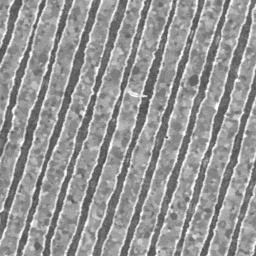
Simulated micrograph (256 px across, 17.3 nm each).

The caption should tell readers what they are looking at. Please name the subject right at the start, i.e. parallel lines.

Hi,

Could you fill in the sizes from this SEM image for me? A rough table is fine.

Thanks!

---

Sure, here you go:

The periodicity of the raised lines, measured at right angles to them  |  25.2 pixels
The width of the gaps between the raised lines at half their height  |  142 nanometres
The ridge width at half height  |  16.5 px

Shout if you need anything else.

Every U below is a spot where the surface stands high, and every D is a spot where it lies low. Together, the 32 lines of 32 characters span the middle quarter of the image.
UUDDDUUUUDDUUUUDDUUUUUDDUUUUDDDU
UUDDUUUUDDDUUUUDDUUUUDDDUUUUDDUU
UDDDUUUUDDUUUUUDDUUUUDDDUUUUDDUU
UDDDUUUUDDUUUUUDUUUUUDDDUUUUDDUU
UDDDUUUUDDUUUUDDUUUUDDDUUUUDDUUU
DDDUUUUDDUUUUUDDUUUUDDDUUUUDDUUU
DDDUUUUDDUUUUUDUUUUUDDDUUUUDDUUU
DDUUUUUDUUUUUUDUUUUUDDDUUUUDUUUU
DDUUUUDDUUUUUDDUUUUDDDUUUUDDUUUU
DDUUUUDDUUUUUDDUUUUDDDUUUUDDUUUU
DDUUUUDDUUUUUDUUUUUDDUUUUUDDUUUU
DUUUUDDDUUUUDDUUUUUDDUUUUDDUUUUU
DUUUUDDUUUUUDDUUUUDDDUUUUDDUUUUD
UUUUUDDUUUUUDUUUUUDDDUUUDDDUUUUD
UUUUDDDUUUUDDUUUUUDDDUUUDDUUUUUD
UUUUDDUUUUUDDUUUUUDDUUUUDDUUUUUD
UUUDDDUUUUDDDUUUUDDDUUUDDDUUUUDD
UUUDDDUUUUDDDUUUUDDUUUUDDDUUUUDD
UUUDDDUUUUDDUUUUUDDUUUUDDDUUUUDD
UUUDDUUUUUDDUUUUDDUUUUDDDUUUUDDD
UUDDDUUUUDDDUUUUDDUUUUDDDUUUUDDU
UUDDUUUUUDDUUUUDDUUUUUDDUUUUUDDU
UUDDUUUUUDDUUUUDDUUUUUDDUUUUDDDU
UUDUUUUUDDDUUUUDDUUUUUDDUUUUDDUU
UDDUUUUUDDDUUUUDDUUUUDDUUUUUDDUU
UDDUUUUUDDUUUUDDDUUUUDDUUUUDDDUU
UDDUUUUDDDUUUUDDUUUUDDDUUUUDDUUU
DDUUUUUDDUUUUUDDUUUUDDDUUUUDDUUU
DDUUUUUDDUUUUDDDUUUUDDUUUUDDDUUU
DUUUUUDDDUUUUDDUUUUUDDUUUUDDDUUU
DUUUUUDDUUUUUDDUUUUDDDUUUDDDDUUU
DUUUUDDDUUUUDDDUUUUDDDUUUDDDUUUU